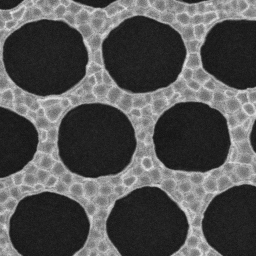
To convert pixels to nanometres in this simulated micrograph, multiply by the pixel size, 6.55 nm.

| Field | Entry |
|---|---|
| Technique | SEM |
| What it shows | holes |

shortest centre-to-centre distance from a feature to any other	0.629	µm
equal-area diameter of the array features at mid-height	521	nm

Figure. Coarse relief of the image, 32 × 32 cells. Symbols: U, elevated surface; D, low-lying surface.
DDUUUUUUUUDDDDUUUUUUUUUUUUUUUUUU
UUUUUUUUUUUUUUUUUUUUUUUUUUUUUUUU
UUUUUDUUUUUUUUUDDDDUUUUUUUUUDDDU
UUDDDDDDDUUUUUDDDDDDDDUUUUDDDDDD
UDDDDDDDDDUUUDDDDDDDDDDUUUDDDDDD
DDDDDDDDDDDUUDDDDDDDDDDUUDDDDDDD
DDDDDDDDDDDUUDDDDDDDDDDUUDDDDDDD
DDDDDDDDDDDUUDDDDDDDDDDUUDDDDDDD
UDDDDDDDDDDUUDDDDDDDDDDUUDDDDDDD
UDDDDDDDDDDUUUDDDDDDDDUUUUUDDDDD
UUDDDDDDDDUUUUUDDDDDDUUUUUUUDDDD
UUUDDDDDUUUUUUUUDDDUUUUUUUUUUUUU
UUUUUUUUUUUUUUUUUUUUUUUUUUUUUUUU
DUUUUUUUUDDDDDDUUUUUUDDDDDDUUUUU
DDDUUUUUDDDDDDDDUUUUDDDDDDDDUUUU
DDDDUUUDDDDDDDDDUUUDDDDDDDDDDUUU
DDDDDUUDDDDDDDDDDUUDDDDDDDDDDUUD
DDDDDUUDDDDDDDDDDUUDDDDDDDDDDUUD
DDDDDUUDDDDDDDDDDUUDDDDDDDDDDUUU
DDDDUUUDDDDDDDDDDUUUDDDDDDDDUUUU
DDDUUUUUDDDDDDDDUUUUDDDDDDDDUUUU
DDUUUUUUUDDDDDDUUUUUUUUUUDUUUUUU
UUUUUUUUUUUUUUUUUUUUUUUUUUUUUUUU
UUUUUUUUUUUUUUUUUUDDUUUUUUUUUDDD
UUUDDDDDUUUUUUUUDDDDDUUUUUUDDDDD
UUDDDDDDDDUUUUDDDDDDDDUUUUDDDDDD
UUDDDDDDDDDUUUDDDDDDDDDUUUDDDDDD
UDDDDDDDDDDUUDDDDDDDDDDUUDDDDDDD
UDDDDDDDDDDUUDDDDDDDDDDDUDDDDDDD
UDDDDDDDDDDUUUDDDDDDDDDUUDDDDDDD
UDDDDDDDDDDUUUDDDDDDDDDUUUDDDDDD
UUDDDDDDDDUUUUUDDDDDDDUUUUUDDDDD